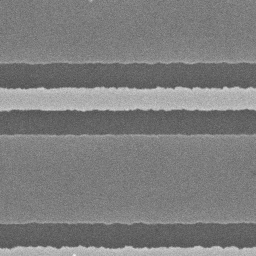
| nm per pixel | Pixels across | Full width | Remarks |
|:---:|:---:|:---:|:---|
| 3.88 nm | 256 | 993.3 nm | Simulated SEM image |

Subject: lines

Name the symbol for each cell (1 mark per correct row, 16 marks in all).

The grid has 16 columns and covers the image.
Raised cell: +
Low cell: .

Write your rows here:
++++++++++++++++
++++++++++++++++
++++++++++++++++
++++++++++++++++
................
................
................
................
++++++++++++++++
++++++++++++++++
++++++++++++++++
++++++++++++++++
++++++++++++++++
++++++++++++++++
................
................